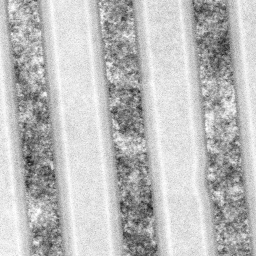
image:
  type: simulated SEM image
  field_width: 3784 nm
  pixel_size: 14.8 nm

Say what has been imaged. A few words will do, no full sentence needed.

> one or a few lines or trenches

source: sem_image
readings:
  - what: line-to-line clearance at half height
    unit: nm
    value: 735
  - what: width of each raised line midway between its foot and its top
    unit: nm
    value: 634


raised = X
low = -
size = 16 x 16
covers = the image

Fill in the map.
---XXX---XXX---X
---XXX---XXX---X
---XXX---XXX---X
---XXX---XXX---X
---XXX---XXX---X
---XXX---XXX---X
X---XX---XXX---X
X---XX----XX---X
X---XXX---XX---X
X---XXX---XX----
X---XXX---XX----
X---XXX---XX----
X---XXX---XXX---
X---XXX---XXX---
X---XXX---XXX---
X---XXX---XXX---